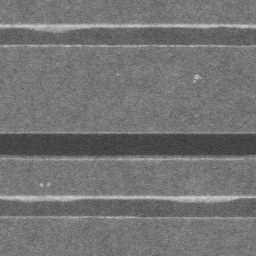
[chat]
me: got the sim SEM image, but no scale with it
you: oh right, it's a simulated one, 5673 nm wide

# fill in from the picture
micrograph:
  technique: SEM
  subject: lines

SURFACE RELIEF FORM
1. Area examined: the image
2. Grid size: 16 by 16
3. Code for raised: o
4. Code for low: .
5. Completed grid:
oooooooooooooooo
oooooooooooooooo
oooooooooooooooo
oooooooooooooooo
oooooooooooooooo
oooooooooooooooo
oooooooooooooooo
oooooooooooooooo
................
................
oooooooooooooooo
oooooooooooooooo
oooooooooooooooo
oooooooooooooooo
oooooooooooooooo
oooooooooooooooo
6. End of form